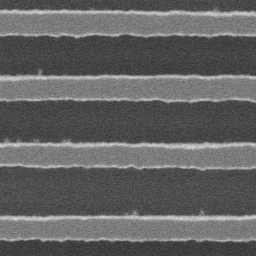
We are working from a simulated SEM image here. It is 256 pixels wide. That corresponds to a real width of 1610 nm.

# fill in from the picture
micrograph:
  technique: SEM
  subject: lines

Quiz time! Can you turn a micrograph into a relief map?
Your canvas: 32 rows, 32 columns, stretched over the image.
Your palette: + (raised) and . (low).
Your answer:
................................
++++++++++++++++++++.+++.++..+++
++++++++++++++++++++++++++++++++
++++++++++++++++++++++++++++++++
.........++.......+......++.....
................................
................................
................................
................................
............++++....+++++..++...
++++++++++++++++++++++++++++++++
++++++++++++++++++++++++++++++++
+++++++..++++++++++.++++++++++++
................................
................................
................................
................................
................................
++++++++++++++++++++++++++++++++
++++++++++++++++++++++++++++++++
++++++++++++++++++++++++++++++++
................................
................................
................................
................................
................................
................................
++++++++++++++++++++++++++++++++
++++++++++++++++++++++++++++++++
++++++++++++++++++++++++++++++++
................................
................................